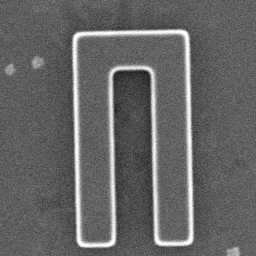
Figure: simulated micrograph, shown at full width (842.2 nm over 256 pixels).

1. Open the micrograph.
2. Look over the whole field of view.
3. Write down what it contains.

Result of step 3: groups of lines, slits or small figures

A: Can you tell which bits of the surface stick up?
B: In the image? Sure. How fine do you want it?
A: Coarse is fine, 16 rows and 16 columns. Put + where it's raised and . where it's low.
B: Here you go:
................
................
.....+++++++....
.....+++++++....
.....++..+++....
.....++...++....
.....++...++....
.....++...++....
.....++...++....
.....++...++....
.....++...++....
.....++...++....
.....++...++....
.....++...++....
.....++...++....
................